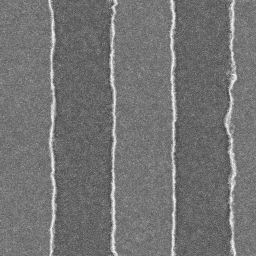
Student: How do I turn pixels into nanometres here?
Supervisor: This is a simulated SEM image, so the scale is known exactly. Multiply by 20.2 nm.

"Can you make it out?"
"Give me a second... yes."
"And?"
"one or a few lines or trenches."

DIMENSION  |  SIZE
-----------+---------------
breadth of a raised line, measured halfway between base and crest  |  1210 nm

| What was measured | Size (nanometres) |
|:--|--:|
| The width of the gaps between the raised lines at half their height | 1210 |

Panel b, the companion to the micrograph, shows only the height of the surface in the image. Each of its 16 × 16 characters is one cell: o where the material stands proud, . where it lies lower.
ooo....oooo....o
ooo....oooo....o
ooo....oooo...oo
ooo....oooo...oo
ooo....oooo....o
ooo....oooo...oo
ooo....oooo...oo
ooo....oooo...oo
ooo....oooo...oo
ooo....oooo...oo
ooo....oooo....o
ooo....oooo...oo
ooo....oooo...oo
ooo....oooo...oo
ooo....oooo...oo
ooo....oooo....o